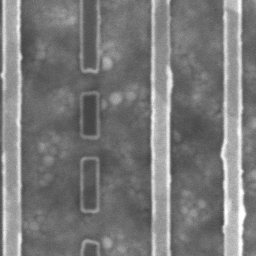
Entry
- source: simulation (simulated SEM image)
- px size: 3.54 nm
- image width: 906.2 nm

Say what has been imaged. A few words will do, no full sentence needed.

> one or a few lines or trenches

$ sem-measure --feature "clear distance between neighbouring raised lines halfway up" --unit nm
191